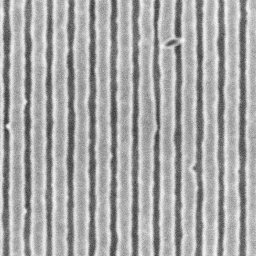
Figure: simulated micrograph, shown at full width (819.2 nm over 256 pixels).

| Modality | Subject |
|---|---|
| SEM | parallel lines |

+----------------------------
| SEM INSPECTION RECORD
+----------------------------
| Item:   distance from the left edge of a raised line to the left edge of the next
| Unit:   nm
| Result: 68.7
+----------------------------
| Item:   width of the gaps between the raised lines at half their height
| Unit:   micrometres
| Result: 0.0244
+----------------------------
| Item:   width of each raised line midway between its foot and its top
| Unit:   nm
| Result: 43.2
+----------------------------